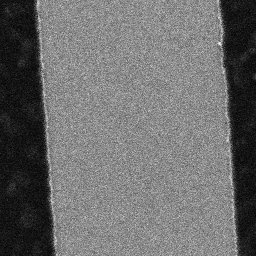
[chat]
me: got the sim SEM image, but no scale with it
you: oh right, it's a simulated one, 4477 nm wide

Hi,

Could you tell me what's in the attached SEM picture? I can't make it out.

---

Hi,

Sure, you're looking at one or a few lines or trenches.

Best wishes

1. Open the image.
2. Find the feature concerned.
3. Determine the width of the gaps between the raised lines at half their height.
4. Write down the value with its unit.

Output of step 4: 3140 nanometers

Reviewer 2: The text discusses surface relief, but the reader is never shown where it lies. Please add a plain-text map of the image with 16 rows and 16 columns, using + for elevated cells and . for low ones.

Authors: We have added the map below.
++............++
++............++
+++...........++
+++...........++
+++...........++
+++...........++
+++...........++
+++...........++
+++...........++
+++...........++
+++...........++
+++...........++
+++............+
+++............+
+++............+
++++...........+